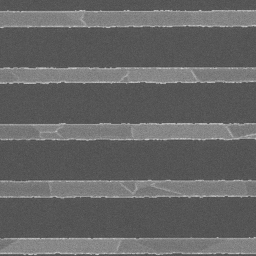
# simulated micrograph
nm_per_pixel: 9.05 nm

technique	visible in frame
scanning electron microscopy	lines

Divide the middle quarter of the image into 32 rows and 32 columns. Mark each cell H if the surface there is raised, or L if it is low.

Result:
LLLLLLLLLLLLLLLLLLLLLLLLLLLLLLLL
HHHHHHHHHHHHHHHHHHHHHHHHHHHHHHHH
HHHHHHHHHHHHHHHHHHHHHHHHHHHHHHHH
HHHHHHHHHHHHHHHHHHHHHHHHHHHHHHHH
HHHHHHHHHHHHHHHHHHHLHHHHHHHHLHHH
LLLLLLLLLLLLLLLLLLLLLLLLLLLLLLLL
LLLLLLLLLLLLLLLLLLLLLLLLLLLLLLLL
LLLLLLLLLLLLLLLLLLLLLLLLLLLLLLLL
LLLLLLLLLLLLLLLLLLLLLLLLLLLLLLLL
LLLLLLLLLLLLLLLLLLLLLLLLLLLLLLLL
LLLLLLLLLLLLLLLLLLLLLLLLLLLLLLLL
LLLLLLLLLLLLLLLLLLLLLLLLLLLLLLLL
LLLLLLLLLLLLLLLLLLLLLLLLLLLLLLLL
LLLLLLLLLLLLLLLLLLLLLLLLLLLLLLLL
LLLLLLLLLLLLLLLLLLLLLLLLLLLLLLLL
HHHHHHHHHHHHHHHHHHHHHHHHHHHHHHHH
HHHHHHHHHHHHHHHHHHHHHHHHHHHHHHHH
HHHHHHHHHHHHHHHHHHHHHHHHHHHHHHHH
HHHHHHHHHHHHHHHHHHHHHHHHHHHHHHHH
LLLLLLLLLLLLLLLLLLLLLLLLLLLLLLLL
LLLLLLLLLLLLLLLLLLLLLLLLLLLLLLLL
LLLLLLLLLLLLLLLLLLLLLLLLLLLLLLLL
LLLLLLLLLLLLLLLLLLLLLLLLLLLLLLLL
LLLLLLLLLLLLLLLLLLLLLLLLLLLLLLLL
LLLLLLLLLLLLLLLLLLLLLLLLLLLLLLLL
LLLLLLLLLLLLLLLLLLLLLLLLLLLLLLLL
LLLLLLLLLLLLLLLLLLLLLLLLLLLLLLLL
LLLLLLLLLLLLLLLLLLLLLLLLLLLLLLLL
LLLLLLLLLLLLLLLLLLLLLLLLLLLLLLLL
HHHHHHHHHHHHHHHHHHHHHHHHHHHHHHHH
HHHHHHHHHHHHHHHHHHHHHHHHHHHHHHHH
HHHHHHHHHHHHHHHHHHHHHHHHHHHHHHHH